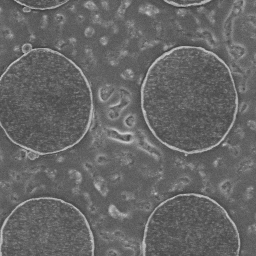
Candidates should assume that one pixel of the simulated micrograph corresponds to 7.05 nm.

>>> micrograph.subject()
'raised bodies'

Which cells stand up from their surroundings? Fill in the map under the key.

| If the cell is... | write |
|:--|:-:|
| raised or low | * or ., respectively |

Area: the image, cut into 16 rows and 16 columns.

..*.............
................
................
.***......***...
*****....*****..
******...******.
******...******.
******...******.
.****.....****..
..**............
................
................
..**......***...
.****....*****..
******...******.
******...******.